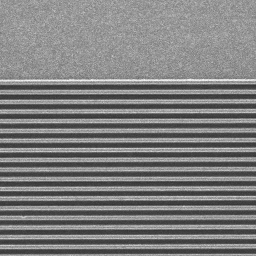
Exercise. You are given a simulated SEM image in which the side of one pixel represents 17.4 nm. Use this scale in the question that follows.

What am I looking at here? parallel lines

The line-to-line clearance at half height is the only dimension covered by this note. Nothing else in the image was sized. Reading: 89 nm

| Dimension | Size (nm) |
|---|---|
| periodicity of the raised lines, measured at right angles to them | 168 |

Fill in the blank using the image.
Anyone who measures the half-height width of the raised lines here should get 75.9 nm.